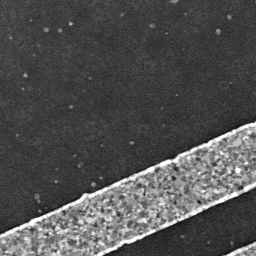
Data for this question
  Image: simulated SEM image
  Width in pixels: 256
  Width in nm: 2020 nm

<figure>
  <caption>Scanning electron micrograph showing one or a few lines or trenches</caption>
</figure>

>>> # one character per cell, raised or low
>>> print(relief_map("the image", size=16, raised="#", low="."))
................
................
................
................
................
................
................
................
..............##
............####
..........######
.......#########
.....#########..
...#########....
.########.......
#######........#